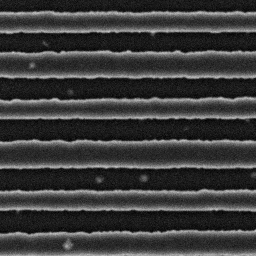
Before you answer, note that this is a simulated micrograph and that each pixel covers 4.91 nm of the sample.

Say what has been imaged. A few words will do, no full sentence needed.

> lines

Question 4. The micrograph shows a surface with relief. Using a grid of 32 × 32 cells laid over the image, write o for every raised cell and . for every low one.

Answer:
................................
.....oo............o....o....o..
oooooooooooooooooooooooooooooooo
oooooooooooooooooooooooooooooooo
................................
................................
.........o..oo.oo....oo..ooo.oo.
oooooooooooooooooooooooooooooooo
oooooooooooooooooooooooooooooooo
oooooooooooooooooooooooooooooooo
................................
................................
..o..oo....ooooooooooooooooooooo
oooooooooooooooooooooooooooooooo
oooooooooooooooooooooooooooooooo
................................
................................
................................
oooooooooooooooooooooooooooooooo
oooooooooooooooooooooooooooooooo
oooooooooooooooooooooooooooooooo
................................
................................
................................
oooooooooooooooooooooooooooooooo
oooooooooooooooooooooooooooooooo
................................
................................
................................
oooooooooooooooooooooooooooooooo
oooooooooooooooooooooooooooooooo
oooooooooooooooooooooooooooooooo